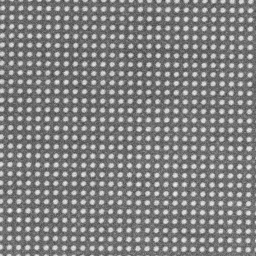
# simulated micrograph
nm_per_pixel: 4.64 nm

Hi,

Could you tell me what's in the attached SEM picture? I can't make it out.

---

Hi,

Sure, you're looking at a regular array of raised bodies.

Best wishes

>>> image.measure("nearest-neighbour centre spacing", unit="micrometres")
0.0419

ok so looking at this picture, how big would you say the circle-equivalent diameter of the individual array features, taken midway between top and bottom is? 22.2 nm